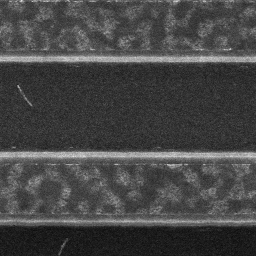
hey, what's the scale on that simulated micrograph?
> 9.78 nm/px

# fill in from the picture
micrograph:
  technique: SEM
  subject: one or a few lines or trenches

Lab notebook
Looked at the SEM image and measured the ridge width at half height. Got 0.667 µm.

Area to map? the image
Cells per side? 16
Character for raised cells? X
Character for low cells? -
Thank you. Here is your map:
XXXXXXXXXXXXXXXX
XXXXXXXXXXXXXXXX
XXXXXXXXXXXXXXXX
XXXXXXXXXXXXXXXX
----------------
----------------
----------------
----------------
----------------
----------------
XXXXXXXXXXXXXXXX
XXXXXXXXXXXXXXXX
XXXXXXXXXXXXXXXX
XXXXXXXXXXXXXXXX
----------------
----------------